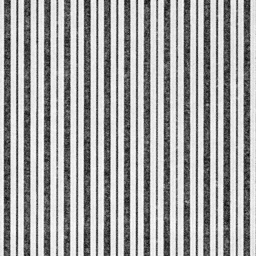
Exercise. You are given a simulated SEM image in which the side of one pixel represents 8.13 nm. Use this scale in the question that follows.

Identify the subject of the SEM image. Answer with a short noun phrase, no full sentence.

parallel lines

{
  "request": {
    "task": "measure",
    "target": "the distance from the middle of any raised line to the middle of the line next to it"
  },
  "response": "81 nm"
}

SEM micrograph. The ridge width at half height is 40.6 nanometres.